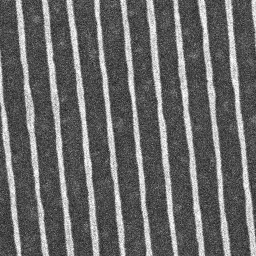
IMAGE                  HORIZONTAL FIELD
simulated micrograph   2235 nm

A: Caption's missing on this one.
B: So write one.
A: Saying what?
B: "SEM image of parallel lines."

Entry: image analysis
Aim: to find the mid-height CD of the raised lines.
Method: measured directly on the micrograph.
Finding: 0.0391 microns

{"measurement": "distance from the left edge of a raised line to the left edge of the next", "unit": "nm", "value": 227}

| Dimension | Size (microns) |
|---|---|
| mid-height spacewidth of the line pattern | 0.19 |